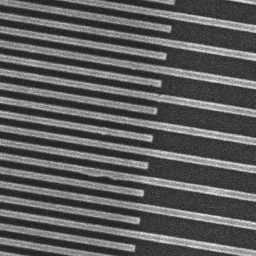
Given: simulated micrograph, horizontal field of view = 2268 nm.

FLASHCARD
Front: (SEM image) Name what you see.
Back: parallel lines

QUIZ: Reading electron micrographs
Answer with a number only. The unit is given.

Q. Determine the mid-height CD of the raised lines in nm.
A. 48.1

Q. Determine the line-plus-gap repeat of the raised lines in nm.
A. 123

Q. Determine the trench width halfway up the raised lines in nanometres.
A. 72.1